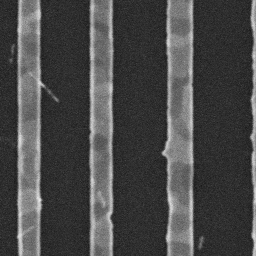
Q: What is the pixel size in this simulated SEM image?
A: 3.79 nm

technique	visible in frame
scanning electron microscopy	one or a few lines or trenches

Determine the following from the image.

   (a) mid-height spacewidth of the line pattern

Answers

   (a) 56.4 px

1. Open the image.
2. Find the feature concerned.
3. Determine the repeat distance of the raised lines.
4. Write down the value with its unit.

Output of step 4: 286 nm